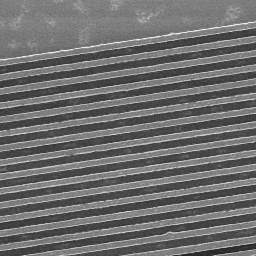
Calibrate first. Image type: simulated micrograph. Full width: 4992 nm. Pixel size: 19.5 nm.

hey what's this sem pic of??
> parallel lines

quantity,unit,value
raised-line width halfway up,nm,118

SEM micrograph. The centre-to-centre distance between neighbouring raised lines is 14.1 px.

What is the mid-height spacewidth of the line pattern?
7.67 pixels